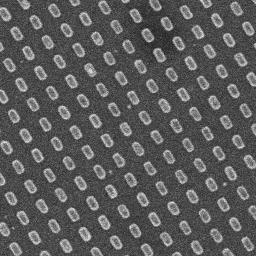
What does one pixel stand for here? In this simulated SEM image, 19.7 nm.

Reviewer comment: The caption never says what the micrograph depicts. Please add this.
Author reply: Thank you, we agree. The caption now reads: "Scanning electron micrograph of a regular array of raised bodies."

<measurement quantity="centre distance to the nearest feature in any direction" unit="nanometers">441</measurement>